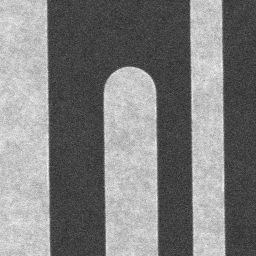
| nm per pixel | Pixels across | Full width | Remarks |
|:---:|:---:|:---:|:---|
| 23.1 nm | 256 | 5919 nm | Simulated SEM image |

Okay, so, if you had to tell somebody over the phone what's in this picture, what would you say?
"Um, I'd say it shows groups of lines, slits or small figures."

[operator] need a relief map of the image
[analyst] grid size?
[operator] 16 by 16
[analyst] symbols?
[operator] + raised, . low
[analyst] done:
+++.........++..
+++.........++..
+++.........++..
+++.........++..
+++....++...++..
+++....+++..++..
+++....+++..++..
+++....+++..++..
+++....+++..++..
+++....+++..++..
+++....+++..++..
+++....+++..++..
+++....+++..++..
+++....+++..++..
+++....+++..++..
+++....+++..++..